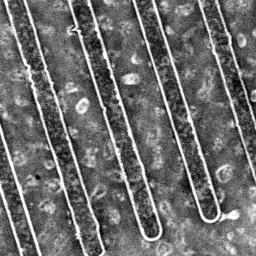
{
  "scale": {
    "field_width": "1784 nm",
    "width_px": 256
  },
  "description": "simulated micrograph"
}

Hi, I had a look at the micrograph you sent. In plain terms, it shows one or a few lines or trenches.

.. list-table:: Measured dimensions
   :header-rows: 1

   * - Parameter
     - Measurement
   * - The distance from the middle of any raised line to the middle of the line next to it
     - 426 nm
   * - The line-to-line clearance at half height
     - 297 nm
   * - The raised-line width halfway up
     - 130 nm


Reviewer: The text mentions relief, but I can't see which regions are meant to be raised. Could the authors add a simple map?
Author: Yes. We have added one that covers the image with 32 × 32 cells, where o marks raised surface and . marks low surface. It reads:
.oo......oo......oo......oo.....
.ooo.....ooo.....ooo.....oo.....
.ooo.....ooo.....ooo......oo....
..oo......oo......oo......oo....
..ooo.....oo......ooo.....ooo...
..ooo.....ooo.....ooo......oo...
...oo......oo......oo......oo...
...oo......oo......oo......oo...
...ooo.....ooo.....ooo.....ooo..
....oo......oo......oo......oo..
....oo......oo......oo......oo..
....ooo.....ooo.....ooo.....ooo.
.....oo......oo......oo......oo.
.....oo......oo......oo......oo.
.....ooo.....ooo.....ooo.....ooo
.....ooo.....ooo......oo......oo
......oo......oo......oo......oo
o.....ooo.....ooo.....ooo.....oo
o.....ooo.....ooo.....ooo......o
o......oo......oo......oo......o
o......ooo.....ooo.....ooo.....o
oo.....ooo.....ooo.....ooo......
oo......oo......oo......oo......
oo......ooo.....oo......oo......
ooo.....ooo.....ooo.....ooo.....
.oo......oo......oo......oo.....
.oo......ooo.....oo......oo.....
.ooo.....ooo.....ooo......o.....
..oo......oo......oo............
..oo......oo......oo............
..ooo.....ooo...................
...oo......oo...................